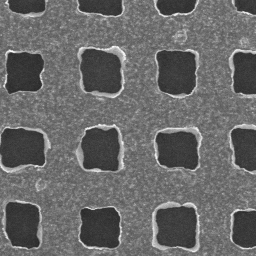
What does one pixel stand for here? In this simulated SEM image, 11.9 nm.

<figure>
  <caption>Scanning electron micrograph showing a regular array of holes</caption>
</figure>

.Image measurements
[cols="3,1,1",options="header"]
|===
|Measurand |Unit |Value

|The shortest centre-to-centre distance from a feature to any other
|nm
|910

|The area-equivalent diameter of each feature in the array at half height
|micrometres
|0.529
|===